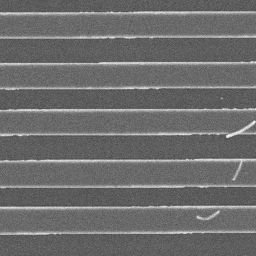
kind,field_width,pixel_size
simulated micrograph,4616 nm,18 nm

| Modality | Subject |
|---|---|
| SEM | lines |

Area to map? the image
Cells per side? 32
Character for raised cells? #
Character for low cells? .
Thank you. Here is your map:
................................
................................
################################
################################
################################
................................
................................
................................
################################
################################
################################
................................
................................
................................
################################
################################
################################
................................
................................
................................
################################
################################
################################
................................
................................
................................
################################
################################
################################
................................
................................
................................